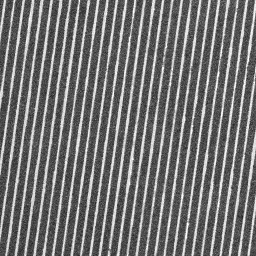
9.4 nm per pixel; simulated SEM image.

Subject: parallel lines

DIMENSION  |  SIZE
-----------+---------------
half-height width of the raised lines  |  12.8 nanometres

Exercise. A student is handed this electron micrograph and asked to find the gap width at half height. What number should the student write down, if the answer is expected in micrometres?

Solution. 0.0745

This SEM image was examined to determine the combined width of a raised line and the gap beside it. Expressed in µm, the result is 0.0867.